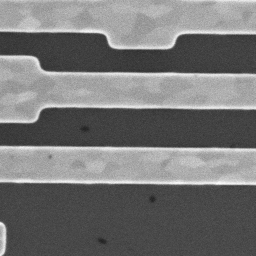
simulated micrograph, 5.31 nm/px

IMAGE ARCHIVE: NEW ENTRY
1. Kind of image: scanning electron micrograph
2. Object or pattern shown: wiring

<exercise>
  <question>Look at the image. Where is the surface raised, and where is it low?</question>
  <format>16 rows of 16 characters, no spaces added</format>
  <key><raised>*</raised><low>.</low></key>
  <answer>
****************
****************
.......****.....
................
***.............
****************
****************
**..............
................
****************
****************
............****
................
................
................
................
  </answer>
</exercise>